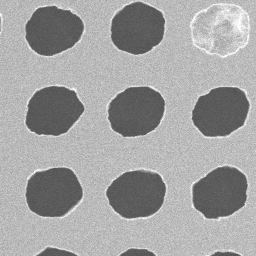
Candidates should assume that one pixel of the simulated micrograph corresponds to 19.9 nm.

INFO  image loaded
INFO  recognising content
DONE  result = a regular array of holes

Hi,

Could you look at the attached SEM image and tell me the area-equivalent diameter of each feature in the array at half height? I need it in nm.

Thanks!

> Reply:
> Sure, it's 1060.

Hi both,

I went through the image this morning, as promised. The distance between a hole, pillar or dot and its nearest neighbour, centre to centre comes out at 1610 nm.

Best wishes